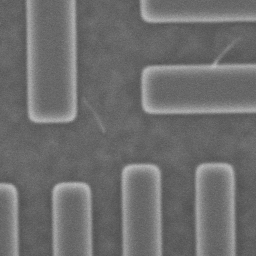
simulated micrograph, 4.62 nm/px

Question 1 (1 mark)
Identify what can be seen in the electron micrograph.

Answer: groups of lines, slits or small figures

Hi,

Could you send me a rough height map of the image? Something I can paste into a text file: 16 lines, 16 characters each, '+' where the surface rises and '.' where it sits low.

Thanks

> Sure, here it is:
..+++....+++++++
..+++...........
..+++...........
..+++...........
..+++....+++++++
..+++....+++++++
..+++....+++++++
..++............
................
................
........++...+..
....+...++..+++.
+..+++..++..+++.
+..+++..++..+++.
+..+++..++..+++.
+..+++..++..+++.